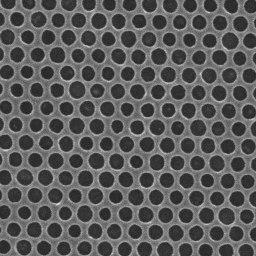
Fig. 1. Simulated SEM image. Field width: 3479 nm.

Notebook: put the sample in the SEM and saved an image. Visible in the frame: a regular array of holes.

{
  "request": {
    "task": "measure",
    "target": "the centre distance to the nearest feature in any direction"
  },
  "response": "269 nm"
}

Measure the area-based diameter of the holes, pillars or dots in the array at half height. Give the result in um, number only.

0.202